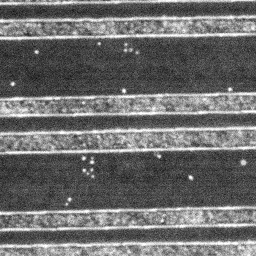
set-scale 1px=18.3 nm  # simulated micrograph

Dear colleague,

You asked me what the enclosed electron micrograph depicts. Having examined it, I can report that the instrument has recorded lines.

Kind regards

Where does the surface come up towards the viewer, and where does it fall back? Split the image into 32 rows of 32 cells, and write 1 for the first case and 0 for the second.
11111111111111111111111111111111
11111111111111111111111111111111
11111111000000000000000000000000
00000000000000000000000000000000
00000000000000000000000111111111
11111111111111111111111111111111
11111111111111111111111111111111
11111111111111111111111111111111
11111111111111111111111111111111
11111111111111111111111111111111
11111111111111111111111111111111
11111111111111111111111111111111
00000000000000000000000000000000
00000000000000000000000000000000
11111111111111111111111111111111
11111111111111111111111111111111
11111111111110000000000000000000
00000000000000000000000000000000
00000000000000000000000000000011
11111111111111111111111111111111
11111111111111111111111111111111
11111111111111111111111111111111
11111111111111111111111111111111
11111111111111111111111111111111
11111111111111111111111111111111
11111111111111111111111111111111
11111111111000000000000000000000
00000000000000000000000000000000
00000000000001111111111111111111
11111111111111111111111111111111
11111111111111100000000000000000
00000000000000000000000000000000